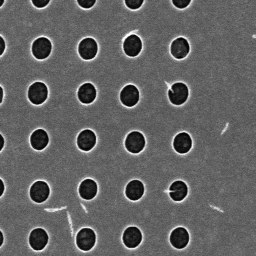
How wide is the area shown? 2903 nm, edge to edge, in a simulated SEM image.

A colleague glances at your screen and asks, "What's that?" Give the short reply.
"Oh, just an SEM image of a regular array of holes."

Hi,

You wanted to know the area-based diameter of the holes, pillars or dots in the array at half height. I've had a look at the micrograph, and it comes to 234 nm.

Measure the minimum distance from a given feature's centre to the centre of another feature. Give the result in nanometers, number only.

520